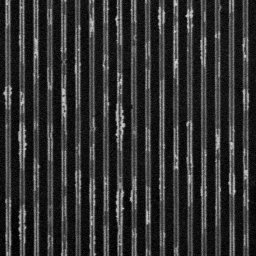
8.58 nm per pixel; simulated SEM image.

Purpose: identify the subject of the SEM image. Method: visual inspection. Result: parallel lines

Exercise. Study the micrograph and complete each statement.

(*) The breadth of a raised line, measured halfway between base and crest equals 39.7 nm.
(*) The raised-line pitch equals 120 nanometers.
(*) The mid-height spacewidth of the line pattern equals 81.5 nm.